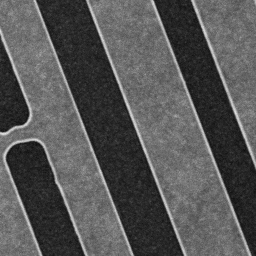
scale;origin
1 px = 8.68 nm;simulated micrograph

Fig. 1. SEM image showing one or a few lines or trenches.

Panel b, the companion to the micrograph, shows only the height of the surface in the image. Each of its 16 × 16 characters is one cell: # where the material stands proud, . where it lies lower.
##....####..####
###...####...###
###...####...###
.###...####..###
.###...####...##
.###....####..##
..###...####...#
..###...####...#
#####....####..#
...###...####...
...###...#####..
#...###...####..
#...###...####..
##..###....####.
##...###...####.
##...###...####.